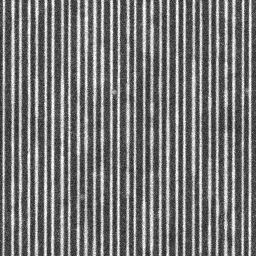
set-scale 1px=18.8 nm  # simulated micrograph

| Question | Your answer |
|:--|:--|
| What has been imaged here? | parallel lines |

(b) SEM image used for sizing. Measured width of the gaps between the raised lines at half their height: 125 nm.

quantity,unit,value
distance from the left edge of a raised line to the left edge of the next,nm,155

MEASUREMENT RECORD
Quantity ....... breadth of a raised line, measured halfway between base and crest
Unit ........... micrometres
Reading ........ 0.0353